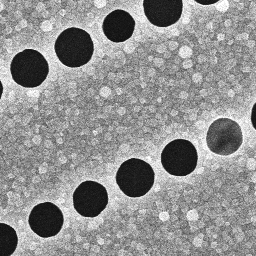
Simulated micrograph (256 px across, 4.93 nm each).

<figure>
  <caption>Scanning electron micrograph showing holes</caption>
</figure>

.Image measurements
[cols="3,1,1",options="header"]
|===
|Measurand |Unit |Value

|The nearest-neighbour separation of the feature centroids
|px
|48.8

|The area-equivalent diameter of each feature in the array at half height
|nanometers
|184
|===